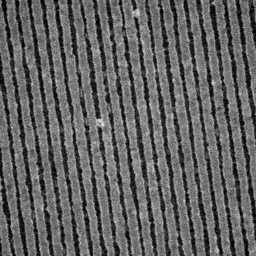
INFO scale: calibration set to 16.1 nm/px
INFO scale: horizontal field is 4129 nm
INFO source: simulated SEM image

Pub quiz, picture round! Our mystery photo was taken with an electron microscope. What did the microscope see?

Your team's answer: parallel lines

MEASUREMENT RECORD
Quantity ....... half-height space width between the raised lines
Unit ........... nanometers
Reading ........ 77.9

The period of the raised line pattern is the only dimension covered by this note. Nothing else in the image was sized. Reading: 207 nm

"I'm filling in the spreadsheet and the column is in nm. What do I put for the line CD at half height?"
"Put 124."